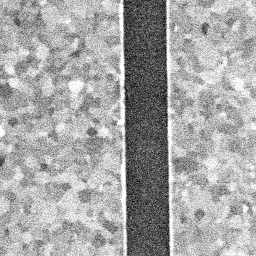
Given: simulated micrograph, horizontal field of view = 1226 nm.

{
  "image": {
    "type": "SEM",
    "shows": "one or a few lines or trenches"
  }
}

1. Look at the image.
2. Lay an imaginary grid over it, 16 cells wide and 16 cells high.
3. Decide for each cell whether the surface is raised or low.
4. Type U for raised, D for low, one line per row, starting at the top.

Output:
UUUUUUUUDDUUUUUU
UUUUUUUUDDUUUUUU
UUUUUUUUDDUUUUUU
UUUUUUUUDDDUUUUU
UUUUUUUUDDDUUUUU
UUUUUUUUDDDUUUUU
UUUUUUUUDDDUUUUU
UUUUUUUUDDDUUUUU
UUUUUUUUDDDUUUUU
UUUUUUUUDDDUUUUU
UUUUUUUUDDDUUUUU
UUUUUUUUDDDUUUUU
UUUUUUUUDDDUUUUU
UUUUUUUUDDDUUUUU
UUUUUUUUDDDUUUUU
UUUUUUUUDDDUUUUU